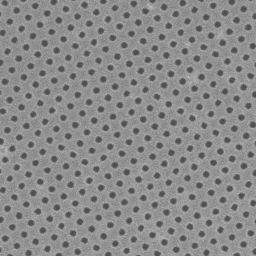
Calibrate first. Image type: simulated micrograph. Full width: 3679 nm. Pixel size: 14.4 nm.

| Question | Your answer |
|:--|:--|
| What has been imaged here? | a regular array of holes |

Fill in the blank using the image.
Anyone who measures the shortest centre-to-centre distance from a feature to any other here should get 190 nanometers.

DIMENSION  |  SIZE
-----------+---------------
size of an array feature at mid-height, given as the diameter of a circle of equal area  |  104 nanometers